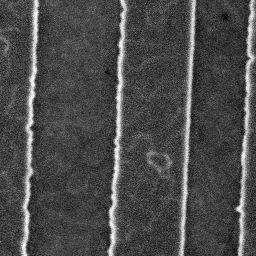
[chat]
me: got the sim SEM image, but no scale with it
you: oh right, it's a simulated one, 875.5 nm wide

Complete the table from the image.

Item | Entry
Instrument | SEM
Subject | one or a few lines or trenches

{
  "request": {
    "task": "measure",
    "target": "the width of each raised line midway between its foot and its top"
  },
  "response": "246 nm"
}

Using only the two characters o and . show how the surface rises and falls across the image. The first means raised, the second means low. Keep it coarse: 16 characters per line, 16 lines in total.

oo......oooo....
oo......oooo....
oo......oooo....
oo......oooo....
oo.....ooooo...o
oo.....ooooo...o
oo.....ooooo...o
oo.....ooooo...o
oo.....ooooo...o
oo.....ooooo...o
oo.....ooooo...o
oo.....ooooo...o
oo.....ooooo...o
oo.....ooooo...o
oo.....oooo....o
oo.....oooo....o